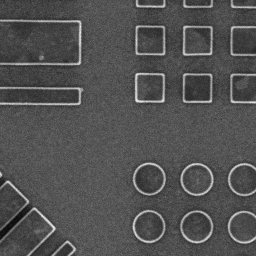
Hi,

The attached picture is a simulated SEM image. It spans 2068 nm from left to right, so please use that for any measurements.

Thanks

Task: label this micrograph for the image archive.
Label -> groups of lines, slits or small figures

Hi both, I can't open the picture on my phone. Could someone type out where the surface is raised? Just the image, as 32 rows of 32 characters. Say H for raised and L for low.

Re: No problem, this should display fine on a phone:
LLLLLLLLLLLLLLLLLHHHLLLHHHLLLHHH
LLLLLLLLLLLLLLLLLLLLLLLLLLLLLLLL
LLLLLLLLLLLLLLLLLLLLLLLLLLLLLLLL
HHHHHHHHHHLLLLLLLHHHLLLHHHLLLHHH
HHHHHHHHHHLLLLLLLHHHLLLHHHLLLHHH
HHHHHHHHHHLLLLLLLHHHLLLHHHLLLHHH
HHHHHHHHHHLLLLLLLHHHLLLHHHLLLHHH
HHHHHHHHHHLLLLLLLLLLLLLLLLLLLLLL
LLLLLLLLLLLLLLLLLLLLLLLLLLLLLLLL
LLLLLLLLLLLLLLLLLHHHLLLHHHLLLHHH
LLLLLLLLLLLLLLLLLHHHLLLHHHLLLHHH
HHHHHHHHHHLLLLLLLHHHLLLHHHLLLHHH
HHHHHHHHHHLLLLLLLHHHLLLHHHLLLHHH
LLLLLLLLLLLLLLLLLLLLLLLLLLLLLLLL
LLLLLLLLLLLLLLLLLLLLLLLLLLLLLLLL
LLLLLLLLLLLLLLLLLLLLLLLLLLLLLLLL
LLLLLLLLLLLLLLLLLLLLLLLLLLLLLLLL
LLLLLLLLLLLLLLLLLLLLLLLLLLLLLLLL
LLLLLLLLLLLLLLLLLLLLLLLLLLLLLLLL
LLLLLLLLLLLLLLLLLLLLLLLLLLLLLLLL
LLLLLLLLLLLLLLLLLLLLLLLLLLLLLLLL
LLLLLLLLLLLLLLLLLHHHLLLHHHLLLHHH
LLLLLLLLLLLLLLLLLHHHHLLHHHLLLHHH
HHLLLLLLLLLLLLLLLHHHLLLHHHLLLHHH
HHHLLLLLLLLLLLLLLLLLLLLLLLLLLLLL
HHHLLLLLLLLLLLLLLLLLLLLLLLLLLLLL
HHLLHLLLLLLLLLLLLLHLLLLLLLLLLLLL
HLLHHHLLLLLLLLLLLHHHLLLHHHLLLHHH
LLHHHHHLLLLLLLLLLHHHLLLHHHLLLHHH
LHHHHHLLLLLLLLLLLHHHLLLHHHLLLHHH
HHHHHLLLHLLLLLLLLLLLLLLLLLLLLLLL
HHHHLLLHHLLLLLLLLLLLLLLLLLLLLLLL